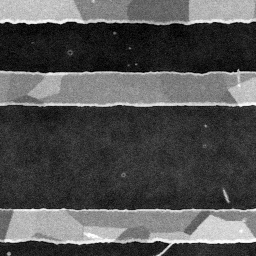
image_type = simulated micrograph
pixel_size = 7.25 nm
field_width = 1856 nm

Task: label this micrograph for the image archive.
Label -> lines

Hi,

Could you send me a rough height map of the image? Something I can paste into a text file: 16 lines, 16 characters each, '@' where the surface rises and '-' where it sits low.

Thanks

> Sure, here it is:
@@@@@@@@@@@@@@@@
----------@-----
----------------
----------------
@-------------@-
@@@@@@@@@@@@@@@@
@@@@@@@@@@@@@@@@
----------------
----------------
----------------
----------------
----------------
----------------
@@@@@@@@@@@@@@@@
@@@@@@@@@@@@@@@@
----------------